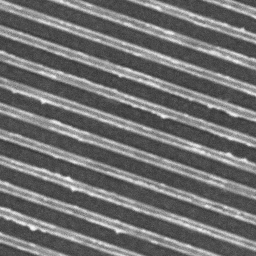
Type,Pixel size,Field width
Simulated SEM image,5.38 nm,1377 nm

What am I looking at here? parallel lines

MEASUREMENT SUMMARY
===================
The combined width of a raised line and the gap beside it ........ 132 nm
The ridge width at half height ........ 47.1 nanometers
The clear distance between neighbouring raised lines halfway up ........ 84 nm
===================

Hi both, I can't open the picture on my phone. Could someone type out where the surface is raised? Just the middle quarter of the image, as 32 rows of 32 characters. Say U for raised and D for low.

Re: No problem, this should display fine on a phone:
DDDDDDDUUUUUUUDDDDDDDDDDDDUUUUUU
DDDDDDDDDDUUUUUUUDDDDDDDDDDDDUUU
UDDDDDDDDDDDDUUUUUUUDDDDDDDDDDDD
UUUUDDDDDDDDDDDDUUUUUUUDDDDDDDDD
UUUUUUUDDDDDDDDDDDDUUUUUUUDDDDDD
DDDUUUUUUUDDDDDDDDDDDDUUUUUUUDDD
DDDDDDUUUUUUUDDDDDDDDDDDDUUUUUUU
DDDDDDDDDUUUUUUUDDDDDDDDDDDDUUUU
DDDDDDDDDDDDUUUUUUDDDDDDDDDDDDUU
UUDDDDDDDDDDDDDUUUUUUDDDDDDDDDDD
UUUUUDDDDDDDDDDDDUUUUUUUDDDDDDDD
DUUUUUUUDDDDDDDDDDDDUUUUUUUDDDDD
DDDDUUUUUUUDDDDDDDDDDDDUUUUUUUDD
DDDDDDDUUUUUUUDDDDDDDDDDDDUUUUUU
DDDDDDDDDDUUUUUUUDDDDDDDDDDDDUUU
UDDDDDDDDDDDDUUUUUUUDDDDDDDDDDDD
UUUUDDDDDDDDDDDDUUUUUUUDDDDDDDDD
UUUUUUUDDDDDDDDDDDDUUUUUUUDDDDDD
DDDUUUUUUUDDDDDDDDDDDDUUUUUUUDDD
DDDDDDUUUUUUUDDDDDDDDDDDDUUUUUUU
DDDDDDDDDUUUUUUUDDDDDDDDDDDDUUUU
DDDDDDDDDDDDUUUUUUUDDDDDDDDDDDDU
UUDDDDDDDDDDDDDUUUUUUUDDDDDDDDDD
UUUUUDDDDDDDDDDDDDUUUUUUUDDDDDDD
DDUUUUUUDDDDDDDDDDDDDUUUUUUUDDDD
DDDDDUUUUUUDDDDDDDDDDDDDUUUUUUUD
DDDDDDDDUUUUUUDDDDDDDDDDDDDUUUUU
DDDDDDDDDDDUUUUUUDDDDDDDDDDDDDUU
UDDDDDDDDDDDDDUUUUUUDDDDDDDDDDDD
UUUUDDDDDDDDDDDDUUUUUUUDDDDDDDDD
UUUUUUUDDDDDDDDDDDDUUUUUUUDDDDDD
DDUUUUUUUDDDDDDDDDDDDDUUUUUUDDDD